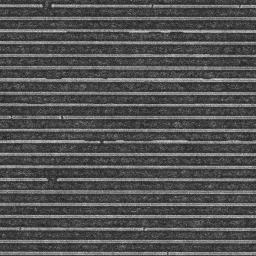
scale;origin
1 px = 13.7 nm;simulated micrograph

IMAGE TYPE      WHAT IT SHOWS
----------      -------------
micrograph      parallel lines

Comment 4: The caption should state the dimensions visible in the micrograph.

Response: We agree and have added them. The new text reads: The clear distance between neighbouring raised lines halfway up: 134 nm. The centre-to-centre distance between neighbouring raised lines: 170 nanometres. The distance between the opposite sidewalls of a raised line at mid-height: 27.5 nanometres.